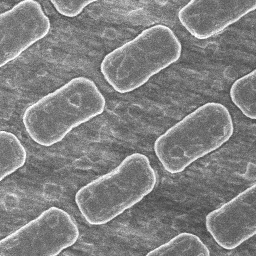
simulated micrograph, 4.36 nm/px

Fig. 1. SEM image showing raised bodies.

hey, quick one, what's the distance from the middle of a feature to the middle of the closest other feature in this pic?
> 411 nanometres